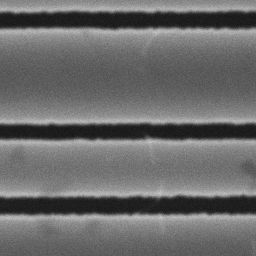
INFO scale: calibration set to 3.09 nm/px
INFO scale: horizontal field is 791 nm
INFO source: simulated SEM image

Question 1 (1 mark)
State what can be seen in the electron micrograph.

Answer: lines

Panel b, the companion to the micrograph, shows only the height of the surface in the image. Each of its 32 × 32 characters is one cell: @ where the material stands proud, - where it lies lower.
@@@@@@@@@@@@@@@@@@@@@@@@@@@@@@@@
-@@@@-@-----------@---@---------
--------------------------------
--------------------------------
@@@@@@@@@@@@@@@@@@@@@@@@@@@@@@@@
@@@@@@@@@@@@@@@@@@@@@@@@@@@@@@@@
@@@@@@@@@@@@@@@@@@@@@@@@@@@@@@@@
@@@@@@@@@@@@@@@@@@@@@@@@@@@@@@@@
@@@@@@@@@@@@@@@@@@@@@@@@@@@@@@@@
@@@@@@@@@@@@@@@@@@@@@@@@@@@@@@@@
@@@@@@@@@@@@@@@@@@@@@@@@@@@@@@@@
@@@@@@@@@@@@@@@@@@@@@@@@@@@@@@@@
@@@@@@@@@@@@@@@@@@@@@@@@@@@@@@@@
@@@@@@@@@@@@@@@@@@@@@@@@@@@@@@@@
@@@@@@@@@@@@@@@@@@@@@@@@@@@@@@@@
----@@--------------------------
--------------------------------
---------@@-------@@---@----@@--
@@@@@@@@@@@@@@@@@@@@@@@@@@@@@@@@
@@@@@@@@@@@@@@@@@@@@@@@@@@@@@@@@
@@@@@@@@@@@@@@@@@@@@@@@@@@@@@@@@
@@@@@@@@@@@@@@@@@@@@@@@@@@@@@@@@
@@@@@@@@@@@@@@@@@@@@@@@@@@@@@@@@
@@@@@@@@@@@@@@@@@@@@@@@@@@@@@@@@
@@@@@-@@@@@@@-@@--@@-@--@-@@----
--------------------------------
--------------------------------
@@@@@@@@@@@@@@@@@@@@@@@@@@@@@@@@
@@@@@@@@@@@@@@@@@@@@@@@@@@@@@@@@
@@@@@@@@@@@@@@@@@@@@@@@@@@@@@@@@
@@@@@@@@@@@@@@@@@@@@@@@@@@@@@@@@
@@@@@@@@@@@@@@@@@@@@@@@@@@@@@@@@